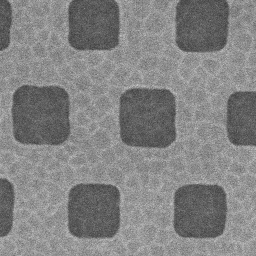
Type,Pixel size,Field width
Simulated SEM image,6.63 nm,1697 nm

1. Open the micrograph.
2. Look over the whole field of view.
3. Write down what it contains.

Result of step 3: holes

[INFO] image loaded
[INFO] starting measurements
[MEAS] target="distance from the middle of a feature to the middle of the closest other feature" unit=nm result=705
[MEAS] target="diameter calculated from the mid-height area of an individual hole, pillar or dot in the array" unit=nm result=409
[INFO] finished